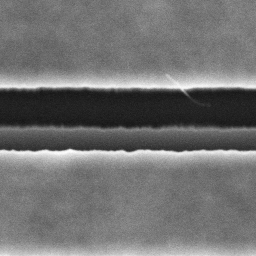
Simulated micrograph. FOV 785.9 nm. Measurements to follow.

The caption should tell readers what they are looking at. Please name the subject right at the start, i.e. lines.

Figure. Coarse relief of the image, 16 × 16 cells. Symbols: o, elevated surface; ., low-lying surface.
oooooooooooooooo
oooooooooooooooo
oooooooooooooooo
oooooooooooooooo
oooooooooooooooo
oooo..oooooo...o
................
................
oooooooooooooooo
oooooooooooooooo
oooooooooooooooo
oooooooooooooooo
oooooooooooooooo
oooooooooooooooo
oooooooooooooooo
oooooooooooooooo